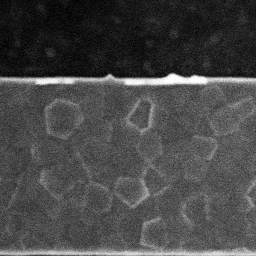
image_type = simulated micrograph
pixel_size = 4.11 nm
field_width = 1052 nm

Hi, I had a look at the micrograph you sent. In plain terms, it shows one or a few lines or trenches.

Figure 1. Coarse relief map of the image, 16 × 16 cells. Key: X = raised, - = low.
----------------
----------------
----------------
----------------
----------------
XXXXXXXXXXXXXXXX
XXXXXXXXXXXXXXXX
XXXXXXXXXXXXXXXX
XXXXXXXXXXXXXXXX
XXXXXXXXXXXXXXXX
XXXXXXXXXXXXXXXX
XXXXXXXXXXXXXXXX
XXXXXXXXXXXXXXXX
XXXXXXXXXXXXXXXX
XXXXXXXXXXXXXXXX
XXXXXXXXXXXXXXXX